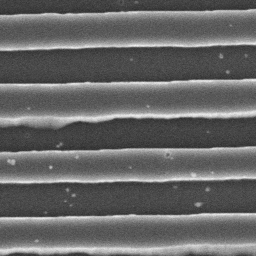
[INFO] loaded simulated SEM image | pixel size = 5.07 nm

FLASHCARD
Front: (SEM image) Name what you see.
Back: lines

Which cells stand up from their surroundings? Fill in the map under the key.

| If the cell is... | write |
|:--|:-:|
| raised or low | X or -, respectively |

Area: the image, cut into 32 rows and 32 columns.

--------------------------------
----------------XXXXXXXXXXXXXXXX
XXXXXXXXXXXXXXXXXXXXXXXXXXXXXXXX
XXXXXXXXXXXXXXXXXXXXXXXXXXXXXXXX
XXXXXXXXXXXXXXXXXXXXXXXXXXXXXXXX
XXXXXXXXXXXXXXXXXXXXXXXXXXXXXX-X
--------------------------------
--------------------------------
--------------------------------
--------------------------------
---------XXXXXXXXXXXXXXXXXXXXXXX
XXXXXXXXXXXXXXXXXXXXXXXXXXXXXXXX
XXXXXXXXXXXXXXXXXXXXXXXXXXXXXXXX
XXXXXXXXXXXXXXXXXXXXXXXXXXXXXXXX
XXXXXXXXXXXXXXX--X--XX----------
--------------------------------
--------------------------------
--------------------------------
------------------------------XX
XXXXXXXXXXXXXXXXXXXXXXXXXXXXXXXX
XXXXXXXXXXXXXXXXXXXXXXXXXXXXXXXX
XXXXXXXXXXXXXXXXXXXXXXXXXXXXXXXX
XXXXXXXXXXXXXXXXXXXXX-----------
--------------------------------
--------------------------------
--------------------------------
--------------------------------
XXXXXXXXXXXXXXXXXXXXXXXXXXXXXXXX
XXXXXXXXXXXXXXXXXXXXXXXXXXXXXXXX
XXXXXXXXXXXXXXXXXXXXXXXXXXXXXXXX
XXXXXXXXXXXXXXXXXXXXXXXXXXXXXXXX
X-------------------------------